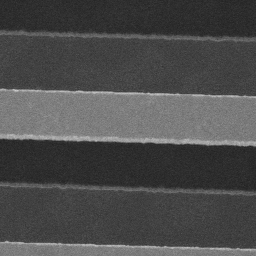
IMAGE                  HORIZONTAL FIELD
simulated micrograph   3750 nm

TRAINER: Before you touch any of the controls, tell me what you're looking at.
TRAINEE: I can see lines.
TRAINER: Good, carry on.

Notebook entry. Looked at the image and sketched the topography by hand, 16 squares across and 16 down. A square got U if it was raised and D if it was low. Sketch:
DDDDDDDDDDDDDDDD
DDDDDDDDDDDDDDDD
UUUUUUUUUUUUUDUD
UUUUUUUUUUUUUUUU
UUUUUUUUUUUUUUUU
UUUUUUUUUUUUUUUU
UUUUUUUUUUUUUUUU
UUUUUUUUUUUUUUUU
UUUUUUUUUUUUUUUU
DDDDDDDDDDDDDDDD
DDDDDDDDDDDDDDDD
DDDDDDDDDDDDDDDD
UUUUUUUUUUUUUUUU
UUUUUUUUUUUUUUUU
UUUUUUUUUUUUUUUU
UUUUUUUUUUUUUUUU